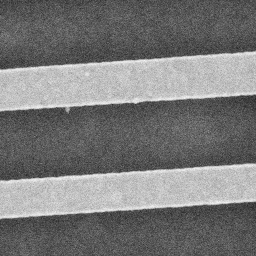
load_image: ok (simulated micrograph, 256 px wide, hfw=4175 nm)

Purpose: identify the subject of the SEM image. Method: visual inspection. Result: lines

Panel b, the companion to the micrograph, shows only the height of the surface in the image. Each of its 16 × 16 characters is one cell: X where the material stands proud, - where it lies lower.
----------------
----------------
----------------
------------XXXX
XXXXXXXXXXXXXXXX
XXXXXXXXXXXXXXXX
XXXXXX----------
----------------
----------------
----------------
------------XXXX
XXXXXXXXXXXXXXXX
XXXXXXXXXXXXXXXX
XX--------------
----------------
----------------